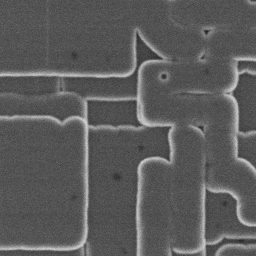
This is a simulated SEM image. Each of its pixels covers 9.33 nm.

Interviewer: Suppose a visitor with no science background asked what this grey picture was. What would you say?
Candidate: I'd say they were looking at wiring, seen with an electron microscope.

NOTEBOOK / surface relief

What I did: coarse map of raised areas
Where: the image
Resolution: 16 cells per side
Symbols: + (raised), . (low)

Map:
++++++++++++++++
++++++++++++++++
++++++++++++++++
++++++++..++++++
+++++++++++++++.
.........++++++.
.........++++++.
+++++....++++++.
+++++......++++.
+++++......++++.
+++++....+++++++
+++++....+++++++
+++++....++++..+
+++++....++++..+
+++++....++++...
+++++....++++...